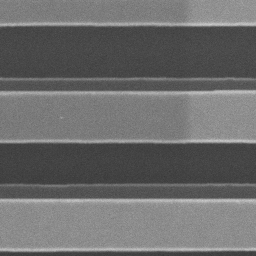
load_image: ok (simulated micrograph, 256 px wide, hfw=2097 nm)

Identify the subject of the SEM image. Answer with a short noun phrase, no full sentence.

lines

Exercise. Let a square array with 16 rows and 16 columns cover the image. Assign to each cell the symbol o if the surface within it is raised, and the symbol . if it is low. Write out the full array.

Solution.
oooooooooooooooo
oooooooooooooooo
................
................
................
oooooooooooooooo
oooooooooooooooo
oooooooooooooooo
oooooooooooooooo
................
................
................
oooooooooooooooo
oooooooooooooooo
oooooooooooooooo
oooooooooooooooo